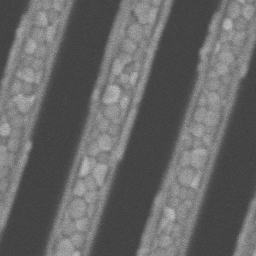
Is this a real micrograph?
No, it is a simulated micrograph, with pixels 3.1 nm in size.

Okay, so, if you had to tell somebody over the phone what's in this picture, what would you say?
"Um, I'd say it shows one or a few lines or trenches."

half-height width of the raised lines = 176 nanometers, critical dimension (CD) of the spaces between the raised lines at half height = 107 nm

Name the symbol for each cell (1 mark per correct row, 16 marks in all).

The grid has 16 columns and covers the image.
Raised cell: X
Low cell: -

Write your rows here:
XX--XXXX--XXXX--
XX--XXXX--XXXX--
X---XXX---XXX---
X--XXXX--XXXX--X
X--XXXX--XXXX--X
---XXX---XXX---X
--XXXX--XXXX--XX
--XXXX--XXXX--XX
--XXX---XXX---XX
-XXXX--XXXX--XXX
-XXXX--XXXX--XXX
-XXX---XXX---XXX
XXXX--XXXX--XXXX
XXXX--XXXX--XXXX
XXX---XXXX--XXX-
XXX--XXXX--XXXX-